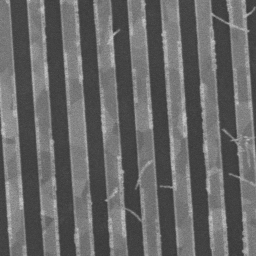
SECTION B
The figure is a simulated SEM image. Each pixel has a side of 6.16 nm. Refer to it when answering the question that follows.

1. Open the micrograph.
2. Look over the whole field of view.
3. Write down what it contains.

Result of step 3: parallel lines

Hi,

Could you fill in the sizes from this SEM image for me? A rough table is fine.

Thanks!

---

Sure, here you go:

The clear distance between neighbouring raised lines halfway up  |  107 nm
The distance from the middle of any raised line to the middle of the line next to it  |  206 nm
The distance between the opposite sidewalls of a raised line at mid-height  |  101 nm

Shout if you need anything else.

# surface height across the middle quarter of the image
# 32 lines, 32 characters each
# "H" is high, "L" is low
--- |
HHHHLLLLLHHHHLLLLHHHHLLLLHHHHHLL
HHHHLLLLLHHHHLLLLHHHHLLLLHHHHHLL
HHHHHLLLLHHHHLLLLHHHHLLLLHHHHHLL
HHHHHLLLLHHHHLLLLHHHHLLLLHHHHHLL
LHHHLLLLLHHHHLLLLHHHHLLLLHHHHHLL
LHHHHLLLLHHHHLLLLHHHHLLLLLHHHHLL
LHHHHLLLLHHHHLLLLHHHHLLLLLHHHHLL
LHHHHLLLLHHHHLLLLHHHHLLLLLHHHHLL
LHHHHLLLLHHHHLLLLLHHHLLLLLHHHHLL
LHHHHLLLLHHHHLLLLLHHHHLLLLHHHHLL
LHHHHLLLLHHHHLLLLLHHHHLLLLHHHHLL
LHHHHLLLLHHHHLLLLLHHHHLLLLHHHHLL
LHHHHLLLLHHHHLLLLLHHHHLLLLHHHHLL
LHHHHLLLLHHHHHLLLLHHHHLLLLHHHHHL
LHHHHLLLLHHHHHLLLLHHHHLLLLHHHHHL
LHHHHLLLLLHHHHLLLLHHHHLLLLHHHHHL
LHHHHLLLLLHHHHLLLLHHHHLLLLLHHHHL
LHHHHLLLLLHHHHLLLLHHHHLLLLLHHHHL
LHHHHLLLLLHHHHLLLLHHHHLLLLLHHHHL
LLHHHLLLLLHHHHLLLLHHHHLLLLLHHHHL
LLHHHHLLLLHHHHLLLLLHHHLLLLLHHHHL
LLHHHHLLLLHHHHLLLLLHHHLLLLLHHHHL
LLHHHHLLLLHHHHLLLLLHHHLLLLLHHHHL
LLHHHHLLLLHHHHLLLLLHHHLLLLLHHHHL
LLHHHHLLLLHHHHLLLLLHHHHLLLLHHHHL
LLHHHHLLLLHHHHLLLLLHHHHLLLLHHHHL
LLHHHHLLLLHHHHHLLLLHHHHLLLLHHHHL
LLHHHHLLLLLHHHHLLLLHHHHLLLLHHHHL
LLHHHHLLLLLHHHHLLLLHHHHLLLLHHHHL
LLHHHHLLLLLHHHHLLLLHHHHLLLLHHHHL
LLHHHHLLLLLHHHHLLLLHHHHLLLLHHHHL
LLHHHHLLLLLHHHHLLLLHHHHLLLLLHHHL